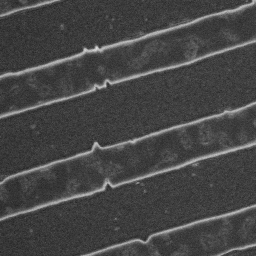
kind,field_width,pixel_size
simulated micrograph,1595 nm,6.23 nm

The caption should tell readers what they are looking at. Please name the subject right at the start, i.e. one or a few lines or trenches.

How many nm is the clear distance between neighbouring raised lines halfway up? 367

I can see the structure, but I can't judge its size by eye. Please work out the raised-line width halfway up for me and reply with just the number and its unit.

239 nanometres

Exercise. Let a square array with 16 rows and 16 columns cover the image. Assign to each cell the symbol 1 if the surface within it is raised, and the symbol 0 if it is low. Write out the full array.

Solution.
1100000000000001
0000000000001111
0000000011111111
0000011111111000
0111111111000000
1111110000000000
1110000000000000
0000000000001111
0000000001111111
0000011111111100
0011111111100000
1111111100000000
1111000000000000
1000000000000011
0000000000111111
0000000111111110